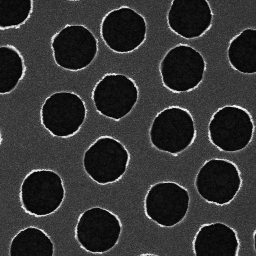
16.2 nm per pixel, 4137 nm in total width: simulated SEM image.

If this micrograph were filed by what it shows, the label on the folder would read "a regular array of holes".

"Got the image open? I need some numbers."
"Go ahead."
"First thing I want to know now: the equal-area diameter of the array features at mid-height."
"701 nanometers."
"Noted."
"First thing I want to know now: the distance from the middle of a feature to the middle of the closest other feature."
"0.892 micrometres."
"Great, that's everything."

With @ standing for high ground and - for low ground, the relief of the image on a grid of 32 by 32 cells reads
----@@@@@@@@@@@@@@@@@@----@@@@@@
----@@@@@@@@@@---@@@@-----@@@@@@
---@@@@@@@@@@-----@@@-----@@@@@@
@@@@@@@@---@@-----@@@-----@@@@@@
@@@@@@@-----@-----@@@@@--@@@@@--
@@@@@@@-----@----@@@@@@@@@@@@---
--@@@@@-----@@@@@@@@@----@@@@---
---@@@@-----@@@@@@@@-----@@@@---
---@@@@@--@@@@@@@@@@------@@@---
---@@@@@@@@@@--@@@@@-----@@@@@@@
--@@@@@@@@@@-----@@@@----@@@@@@@
-@@@@@@@@@@@-----@@@@@@@@@@@@@@@
@@@@@@----@@-----@@@@@@@@@@@@@@@
@@@@@------@----@@@@@@@@@@@@--@@
@@@@@------@@--@@@@@----@@@----@
@@@@@@----@@@@@@@@@-----@@------
@@@@@@---@@@@@@@@@@-----@@-----@
@@@@@@@@@@@@@-@@@@@-----@@@----@
@@@@@@@@@@@----@@@@@---@@@@@--@@
@@@@@@@@@@@-----@@@@@@@@@@@@@@@@
@@@@@@@@@@@-----@@@@@@@@@@---@@@
@@@@---@@@@----@@@@@@@@@@-----@@
@@@-----@@@@--@@@@@@@@@@@-----@@
@@@-----@@@@@@@@@@@----@@-----@@
@@@-----@@@@@@@@@@------@----@@@
@@@----@@@@@@@@@@@------@@@@@@@@
@@@@--@@@@@---@@@@-----@@@@@@@@@
@@@@@@@@@@-----@@@@----@@@@@@@@@
@@@@@@@@@@-----@@@@@@@@@@----@@@
@@----@@@@-----@@@@@@@@@@----@@@
@-----@@@@----@@@@@@@@@@------@@
@------@@@@@@@@@@@@@@@@@-----@@@